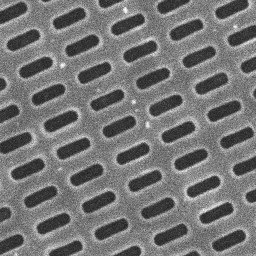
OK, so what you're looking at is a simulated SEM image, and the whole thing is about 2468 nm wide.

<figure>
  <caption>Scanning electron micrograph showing a regular array of holes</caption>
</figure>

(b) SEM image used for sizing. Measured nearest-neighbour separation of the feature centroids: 287 nm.